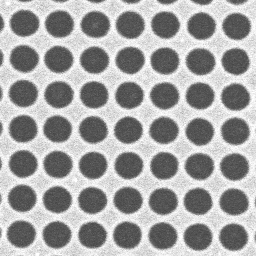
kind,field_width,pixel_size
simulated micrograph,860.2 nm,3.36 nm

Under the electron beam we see a regular array of holes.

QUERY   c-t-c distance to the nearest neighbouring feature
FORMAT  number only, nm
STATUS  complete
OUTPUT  117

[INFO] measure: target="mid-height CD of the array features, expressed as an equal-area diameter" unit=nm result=95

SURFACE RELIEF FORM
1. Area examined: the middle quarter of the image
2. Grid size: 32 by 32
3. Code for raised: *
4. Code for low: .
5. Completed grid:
..**.......**.......**.......**.
.****.....****.....****.....***.
*******.********.*******..******
********************************
*******..******..***************
..***.....****.....****.....****
..**.......**.......**......***.
..**.......**.......*........*..
..**.......**.......*........*..
..***......**.......**.......**.
.****.....****.....****....****.
********************************
********************************
*****....*****....******..******
.***......***......***......***.
..**.......**.......**......**..
..**.......*........*........*..
..**.......**.......*.......**..
.***......***......***......***.
*****....*****....*****....*****
********************************
********************************
.****....*****....*****....*****
..**......***......***......***.
..**.......**.......**.......*..
..*........*........*........*..
..**.......**.......**.......*..
.****.....***......***......***.
******...******...*****....*****
********************************
********************************
.****....****.....*****....*****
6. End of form